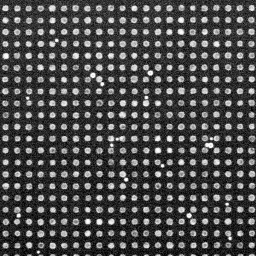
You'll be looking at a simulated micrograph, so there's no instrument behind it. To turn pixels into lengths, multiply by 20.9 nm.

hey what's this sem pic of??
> a regular array of raised bodies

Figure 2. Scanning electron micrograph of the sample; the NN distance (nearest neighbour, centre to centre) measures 241 nm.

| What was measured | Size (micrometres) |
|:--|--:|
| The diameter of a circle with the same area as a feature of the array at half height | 0.103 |